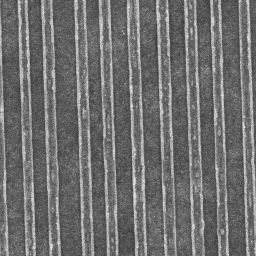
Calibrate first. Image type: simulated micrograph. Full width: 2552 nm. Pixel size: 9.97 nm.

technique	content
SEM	parallel lines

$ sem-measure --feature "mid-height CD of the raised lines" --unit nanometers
103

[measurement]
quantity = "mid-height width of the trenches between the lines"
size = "169 nm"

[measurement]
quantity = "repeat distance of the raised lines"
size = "0.275 um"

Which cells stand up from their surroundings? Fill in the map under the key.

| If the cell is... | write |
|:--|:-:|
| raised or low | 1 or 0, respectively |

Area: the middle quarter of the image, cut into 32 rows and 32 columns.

00011100011100001110000011000001
00011100011100001110000011000001
00011100001100001110000011000001
00011100001100001110000011000001
00011100001100001110000011100001
00001100001100000110000011100001
00001100001100000110000011100001
00011100001100000110000011100001
00011100001100000110000011100001
00011100001100000110000011100001
00011100001100000110000011100001
00001100001100000110000011100001
00001100001100000110000011100001
00001100001100000110000011100001
00001100001100000110000011100001
00001100001100000110000011100001
00001100001100000110000011100001
00001100001100000111000011100001
00001100001100000111000011100001
00001100001100000111000011100001
00001100001110000111000011100001
00001100001110000111000011100001
00001100001110000111000011100001
00001100001110000111000011100000
00001110001110000111000001100000
00001110001110000111000001100000
00001110001110000111000001100000
00001110001110000111000001100000
00001110001110000111000001100000
00001110001110000111000001100000
00001110001110000111000001100000
00001110000110000111000001110000